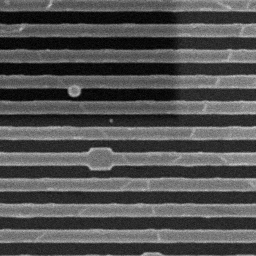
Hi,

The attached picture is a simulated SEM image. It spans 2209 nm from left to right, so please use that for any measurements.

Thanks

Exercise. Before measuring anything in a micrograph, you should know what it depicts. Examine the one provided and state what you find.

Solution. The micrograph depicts wiring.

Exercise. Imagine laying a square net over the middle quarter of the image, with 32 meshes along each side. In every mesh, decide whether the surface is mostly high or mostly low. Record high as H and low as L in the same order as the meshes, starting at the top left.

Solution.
LLLLLLLLLLLLLLLLLLLLLLLLLLLLLLLL
LLLLLLLLLLLLLLLLLLLLLLLLLLLLLLLL
LLLLLLLLLLLLLLLLLLLLLLLLLLLLLLLL
HHHHHHHHHHHHHHHHHHHHHHHHHHHHHHHH
HHHHHHHHHHHHHHHHHHHHHHHHHHHHHHHH
HHHHHHHHHHHHHHHHHHHHHHHHHHHHHHHH
LHHHLLLLLLLLLLLLLLLLLLLLLLLLLLLL
LHHHLLLLLLLLLLLLLLLLLLLLLLLLLLLL
LLLLLLLLLLLLLLLLLLLLLLLLLLLLLLLL
HHLLLLLLLLLLLLLLLLHHHHHLLLHHHHHL
HHHHHHHHHHHHHHHHHHHHHHHHHHHHHHHH
HHHHHHHHHHHHHHHHHHHHHHHHHHHHHHHH
LLLLLLLLLLLLLLLLLLLLLLLLLLLLLLLL
LLLLLLLLLLLLLLLLLLLLLLLLLLLLLLLL
LLLLLLLLLLLLLLLLLLLLLLLLLLLLLLLL
LLLLLLLLLLLLLLLLLLLLLLLLLLLLLLLL
HHHHHHHHHHHHHHHHHHHHHHHHHHHHHHHH
HHHHHHHHHHHHHHHHHHHHHHHHHHHHHHHH
HHHHHHHHHHHHHHHHHHHHHHHHHHHHHHHH
LLLLLLLLLLLLLLLLLLLLLLLLLLLLLLLL
LLLLLLLLLLLLLLLLLLLLLLLLLLLLLLLL
LLLLLLLHHHHHLLLLLLLLLLLLLLLLLLLL
HHHHHHHHHHHHHHHHHHHHHHHHHHHHHHHH
HHHHHHHHHHHHHHHHHHHHHHHHHHHHHHHH
HHHHHHHHHHHHHHHHHHHHHHHHHHHHHHHH
LLLLLLHHHHHHLLLLLLLLLLLLLLLLLLLL
LLLLLLLLLLLLLLLLLLLLLLLLLLLLLLLL
LLLLLLLLLLLLLLLLLLLLLLLLLLLLLLLL
LLLLLLLLLLLLLLLLLLLLLLLLLLLLLLLL
HHHHHHHHHHHHHHHHHHHHHHHHHHHHHHHH
HHHHHHHHHHHHHHHHHHHHHHHHHHHHHHHH
HHHHHHHHHHHHHHHHHHHHHHHHHHHHHHHH